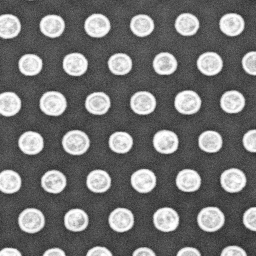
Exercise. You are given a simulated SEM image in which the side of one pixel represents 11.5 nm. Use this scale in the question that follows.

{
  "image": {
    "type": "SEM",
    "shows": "a regular array of raised bodies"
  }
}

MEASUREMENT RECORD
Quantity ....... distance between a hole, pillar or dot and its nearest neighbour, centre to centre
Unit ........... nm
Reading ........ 515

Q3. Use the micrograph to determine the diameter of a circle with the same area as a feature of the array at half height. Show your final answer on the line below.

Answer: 253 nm